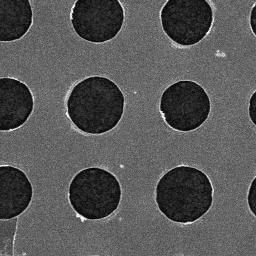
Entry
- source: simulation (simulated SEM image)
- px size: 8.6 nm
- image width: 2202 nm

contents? holes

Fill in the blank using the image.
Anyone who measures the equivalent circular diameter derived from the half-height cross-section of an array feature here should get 467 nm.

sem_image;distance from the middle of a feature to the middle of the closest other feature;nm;760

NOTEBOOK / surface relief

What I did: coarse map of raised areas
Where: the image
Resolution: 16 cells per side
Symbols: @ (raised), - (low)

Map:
--@@@---@@---@@@
--@@@---@@---@@@
-@@@@--@@@@--@@@
@@@@@@@@@@@@@@@@
@@@@@@@@@@@@@@@@
--@@@--@@@@--@@@
--@@----@@---@@@
--@@---@@@---@@@
@@@@@@@@@@@@@@@@
@@@@@@@@@@@@@@@@
-@@@@@@@@@@-@@@@
--@@---@@@---@@@
--@@---@@@---@@@
-@@@@--@@@---@@@
-@@@@@@@@@@@@@@@
-@@@@@@@@@@@@@@@